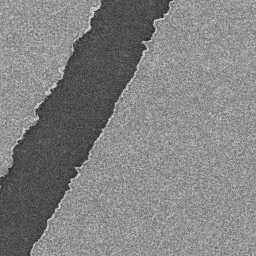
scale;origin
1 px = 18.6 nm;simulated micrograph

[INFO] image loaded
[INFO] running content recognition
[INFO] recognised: one or a few lines or trenches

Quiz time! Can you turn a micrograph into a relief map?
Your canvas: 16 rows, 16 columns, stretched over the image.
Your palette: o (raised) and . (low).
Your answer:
oooooo.....ooooo
oooooo....oooooo
ooooo....ooooooo
oooo.....ooooooo
oooo....oooooooo
ooo.....oooooooo
oo.....ooooooooo
oo.....ooooooooo
o.....oooooooooo
o.....oooooooooo
o....ooooooooooo
....oooooooooooo
....oooooooooooo
...ooooooooooooo
...ooooooooooooo
..oooooooooooooo